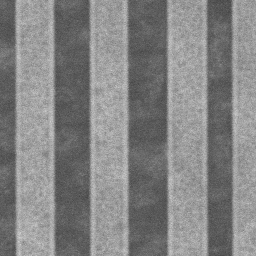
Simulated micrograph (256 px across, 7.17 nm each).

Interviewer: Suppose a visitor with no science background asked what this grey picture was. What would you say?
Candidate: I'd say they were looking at one or a few lines or trenches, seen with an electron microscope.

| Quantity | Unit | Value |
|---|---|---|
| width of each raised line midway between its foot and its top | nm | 239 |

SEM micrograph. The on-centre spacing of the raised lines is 546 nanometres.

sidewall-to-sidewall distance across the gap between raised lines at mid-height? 0.295 µm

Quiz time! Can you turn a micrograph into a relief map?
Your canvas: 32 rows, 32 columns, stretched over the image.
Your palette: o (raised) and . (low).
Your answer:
..oooo......oooo.....oooo....ooo
..oooo......oooo.....oooo....ooo
..oooo......oooo.....oooo....ooo
..oooo......oooo.....ooooo...ooo
..oooo......oooo.....oooo....ooo
..oooo......oooo.....oooo....ooo
..oooo......oooo.....oooo....ooo
..oooo......oooo.....ooooo...ooo
..oooo......oooo.....ooooo...ooo
..oooo......oooo.....ooooo...ooo
..oooo......oooo.....ooooo...ooo
..oooo......oooo.....ooooo...ooo
..oooo......oooo.....ooooo...ooo
..oooo......oooo.....ooooo...ooo
..oooo......oooo.....ooooo...ooo
..oooo......oooo.....ooooo...ooo
..oooo......oooo.....ooooo...ooo
..oooo......oooo.....ooooo...ooo
..oooo......oooo.....ooooo...ooo
..oooo......oooo.....ooooo...ooo
..oooo......oooo.....ooooo...ooo
..oooo......oooo.....ooooo...ooo
..oooo......oooo.....ooooo...ooo
..oooo......oooo.....ooooo...ooo
..oooo......oooo.....ooooo...ooo
..oooo......oooo.....ooooo...ooo
..oooo......oooo.....ooooo...ooo
..oooo......oooo.....ooooo...ooo
..oooo......oooo.....ooooo...ooo
..oooo......oooo.....ooooo...ooo
..oooo......oooo.....ooooo...ooo
..oooo......oooo.....ooooo....oo